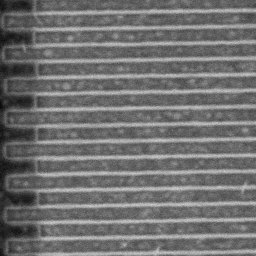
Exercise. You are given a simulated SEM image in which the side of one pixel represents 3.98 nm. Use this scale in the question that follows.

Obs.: parallel lines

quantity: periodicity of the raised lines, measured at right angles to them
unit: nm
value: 64.1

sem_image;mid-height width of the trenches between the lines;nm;50.2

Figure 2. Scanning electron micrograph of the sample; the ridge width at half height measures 11.9 nanometers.